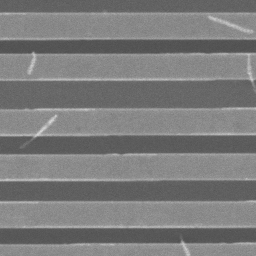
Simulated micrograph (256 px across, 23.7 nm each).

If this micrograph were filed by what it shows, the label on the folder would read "lines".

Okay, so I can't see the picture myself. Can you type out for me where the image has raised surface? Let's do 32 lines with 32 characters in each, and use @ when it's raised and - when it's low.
--------------------------------
--------------------------------
@@@@@@@@@@@@@@@@@@@@@@@@@@@@@@@@
@@@@@@@@@@@@@@@@@@@@@@@@@@@@@@@@
@@@@@@@@@@@@@@@@@@@@@@@@@@@@@@@@
--------------------------------
--------------------------------
@@@@@@@@@@@@@@@@@@@@@@@@@@@@@@@@
@@@@@@@@@@@@@@@@@@@@@@@@@@@@@@@@
@@@@@@@@@@@@@@@@@@@@@@@@@@@@@@@@
--------------------------------
--------------------------------
--------------------------------
--------------------------------
@@@@@@@@@@@@@@@@@@@@@@@@@@@@@@@@
@@@@@@@@@@@@@@@@@@@@@@@@@@@@@@@@
@@@@@@@@@@@@@@@@@@@@@@@@@@@@@@@@
--------------------------------
--------------------------------
@@@@@@@@@@@@@@@@@@@@@@@@@@@@@@@@
@@@@@@@@@@@@@@@@@@@@@@@@@@@@@@@@
@@@@@@@@@@@@@@@@@@@@@@@@@@@@@@@@
@@@@@@@@@@@@@@@@@@@@------------
--------------------------------
--------------------------------
@@@@@@@@@@@@@@@@@@@@@@@@@@@@@@@@
@@@@@@@@@@@@@@@@@@@@@@@@@@@@@@@@
@@@@@@@@@@@@@@@@@@@@@@@@@@@@@@@@
--------------------------------
--------------------------------
----------------------@----@@@@@
@@@@@@@@@@@@@@@@@@@@@@@@@@@@@@@@